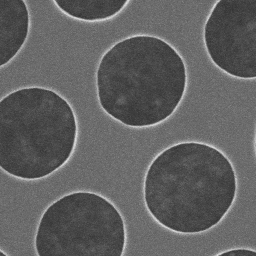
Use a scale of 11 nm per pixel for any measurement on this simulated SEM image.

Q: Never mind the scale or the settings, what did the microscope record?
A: holes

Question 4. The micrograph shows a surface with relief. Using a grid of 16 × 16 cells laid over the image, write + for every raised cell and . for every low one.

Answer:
..++....+++++...
..+++++++++++...
..++++++..+++...
.++++++....++...
++++++......++..
++++++......++++
....++.....+++++
.....++...++++++
.....+++++++++++
....++++++....++
....+++++.....++
+++++++++......+
++++...++......+
+++....+++....++
++......+++.++++
++......++++++++